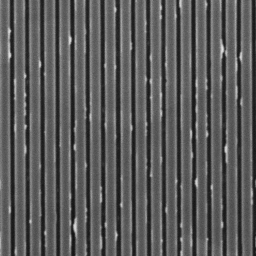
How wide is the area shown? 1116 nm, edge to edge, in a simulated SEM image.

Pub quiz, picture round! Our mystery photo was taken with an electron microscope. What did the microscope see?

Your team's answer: parallel lines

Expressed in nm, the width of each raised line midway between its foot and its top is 48.5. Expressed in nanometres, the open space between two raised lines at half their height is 20.2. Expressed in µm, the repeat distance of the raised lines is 0.0659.